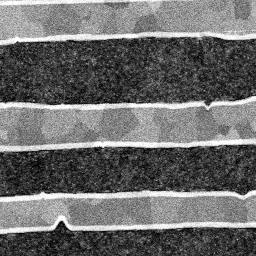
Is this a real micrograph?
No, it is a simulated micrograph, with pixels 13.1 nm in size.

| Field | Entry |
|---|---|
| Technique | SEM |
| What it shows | one or a few lines or trenches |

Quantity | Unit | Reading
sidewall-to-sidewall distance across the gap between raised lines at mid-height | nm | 767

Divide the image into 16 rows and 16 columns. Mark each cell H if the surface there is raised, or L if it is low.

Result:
HHHHHHHHHHHHHHHH
HHHHHHHHHHHHHHHH
HLLLLLLLLLLLLLLL
LLLLLLLLLLLLLLLL
LLLLLLLLLLLLLLLL
LLLLLLLLLLLLLLLL
LLLLLLLLLLLLLLHH
HHHHHHHHHHHHHHHH
HHHHHHHHHHHHHHHH
LLLLLLLLLLLLLLLL
LLLLLLLLLLLLLLLL
LLLLLLLLLLLLLLLL
HHHHHHHHHHHHHHHH
HHHHHHHHHHHHHHHH
LLLLLLLLLLLLLLLL
LLLLLLLLLLLLLLLL